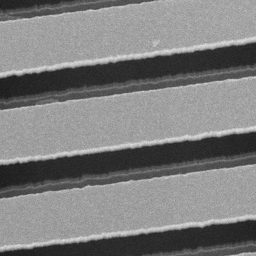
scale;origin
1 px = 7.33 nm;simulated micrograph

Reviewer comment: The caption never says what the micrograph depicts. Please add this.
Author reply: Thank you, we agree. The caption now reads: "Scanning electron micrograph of lines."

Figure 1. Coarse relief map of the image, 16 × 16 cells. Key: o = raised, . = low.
.......ooooooooo
oooooooooooooooo
oooooooooooooooo
oooooooooo......
ooo.............
..........oooooo
...ooooooooooooo
oooooooooooooooo
oooooooooooooo..
oooooo..........
..............oo
.......ooooooooo
oooooooooooooooo
oooooooooooooooo
oooooooooo......
oo..............